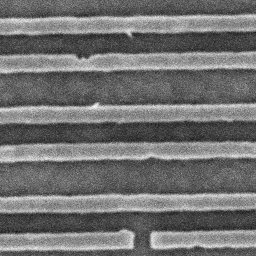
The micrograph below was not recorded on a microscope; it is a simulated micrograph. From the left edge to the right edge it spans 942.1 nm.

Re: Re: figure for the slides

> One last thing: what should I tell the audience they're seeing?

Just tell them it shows parallel lines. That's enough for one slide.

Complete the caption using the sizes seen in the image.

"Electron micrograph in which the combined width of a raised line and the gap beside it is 159 nm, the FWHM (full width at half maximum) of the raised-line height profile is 54.7 nm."